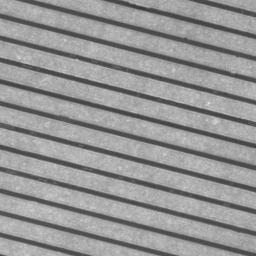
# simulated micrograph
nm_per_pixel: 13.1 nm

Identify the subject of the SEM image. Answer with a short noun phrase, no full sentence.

parallel lines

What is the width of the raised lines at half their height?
216 nm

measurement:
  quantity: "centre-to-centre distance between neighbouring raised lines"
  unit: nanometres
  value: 277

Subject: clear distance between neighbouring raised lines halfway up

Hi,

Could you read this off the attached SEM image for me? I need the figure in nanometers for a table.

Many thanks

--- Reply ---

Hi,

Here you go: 63.4